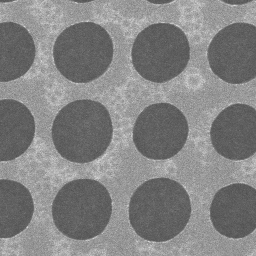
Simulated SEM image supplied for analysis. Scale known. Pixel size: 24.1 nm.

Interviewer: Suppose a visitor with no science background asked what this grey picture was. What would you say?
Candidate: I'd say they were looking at holes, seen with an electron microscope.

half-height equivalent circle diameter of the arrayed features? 1.48 micrometres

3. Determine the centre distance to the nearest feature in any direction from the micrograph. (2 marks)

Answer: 1870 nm